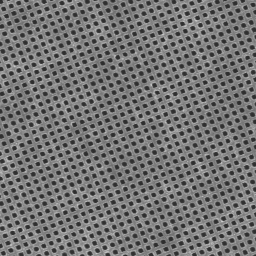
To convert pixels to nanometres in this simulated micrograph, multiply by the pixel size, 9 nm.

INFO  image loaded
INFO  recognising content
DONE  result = a regular array of holes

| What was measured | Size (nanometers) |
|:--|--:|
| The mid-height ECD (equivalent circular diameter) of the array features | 44.3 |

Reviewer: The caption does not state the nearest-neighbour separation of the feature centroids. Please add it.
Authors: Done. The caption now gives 0.0693 microns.